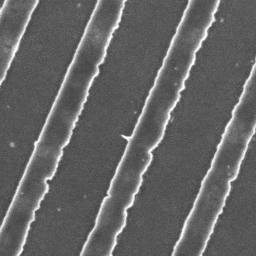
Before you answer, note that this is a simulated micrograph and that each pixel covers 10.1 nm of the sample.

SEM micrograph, one or a few lines or trenches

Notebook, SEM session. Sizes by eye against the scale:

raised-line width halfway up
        276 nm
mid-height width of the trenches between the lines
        572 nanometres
